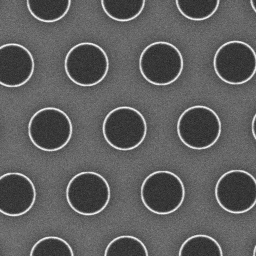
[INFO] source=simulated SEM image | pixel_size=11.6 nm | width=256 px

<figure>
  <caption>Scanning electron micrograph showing an array of small figures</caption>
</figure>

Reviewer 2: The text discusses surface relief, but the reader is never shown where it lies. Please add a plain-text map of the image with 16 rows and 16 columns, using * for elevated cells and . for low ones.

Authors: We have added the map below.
..**..***..***..
................
................
**..***..**..***
**..***..**...**
................
................
..**...**..***..
..**...**..***..
................
................
**..***..**...**
**..***..**...**
................
................
..**...**..***..